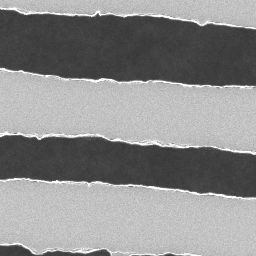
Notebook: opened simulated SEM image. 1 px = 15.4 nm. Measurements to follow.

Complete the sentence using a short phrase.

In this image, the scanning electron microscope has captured one or a few lines or trenches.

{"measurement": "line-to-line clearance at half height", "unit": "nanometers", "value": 968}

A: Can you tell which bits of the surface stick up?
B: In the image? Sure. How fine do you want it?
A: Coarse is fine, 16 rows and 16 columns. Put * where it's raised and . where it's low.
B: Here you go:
................
**************..
****************
****************
.***************
................
................
................
**.*.*..........
***************.
****************
.......*********
................
................
................
**..............